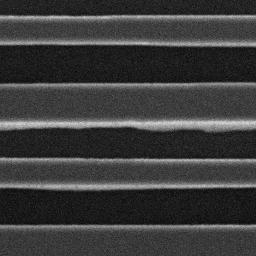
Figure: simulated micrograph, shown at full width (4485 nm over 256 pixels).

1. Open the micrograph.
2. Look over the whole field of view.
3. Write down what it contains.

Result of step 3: lines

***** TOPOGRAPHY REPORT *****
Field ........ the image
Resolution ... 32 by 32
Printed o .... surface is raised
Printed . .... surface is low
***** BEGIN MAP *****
................................
................................
oooooooooooooooooooooooooooooooo
oooooooooooooooooooooooooooooooo
oooooooooooooooooooooooooooooooo
...........................ooooo
................................
................................
................................
................................
....................oo.ooooooooo
oooooooooooooooooooooooooooooooo
oooooooooooooooooooooooooooooooo
oooooooooooooooooooooooooooooooo
oooooooooooooooooooooooooooooooo
oooooooooooooooooooooooooooooooo
................................
................................
................................
................................
oooooooooooooooooooooooooooooooo
oooooooooooooooooooooooooooooooo
oooooooooooooooooooooooooooooooo
................................
................................
................................
................................
................................
oooooooooooooooooooooooooooooooo
oooooooooooooooooooooooooooooooo
oooooooooooooooooooooooooooooooo
oooooooooooooooooooooooooooooooo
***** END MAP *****